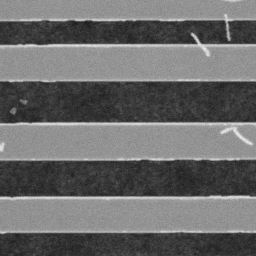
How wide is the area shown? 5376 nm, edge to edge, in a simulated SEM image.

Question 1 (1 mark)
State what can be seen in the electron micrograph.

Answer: lines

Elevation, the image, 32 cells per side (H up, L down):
HHHHHHHHHHHHHHHHHHHHHHHHHHHHHHHH
HHHHHHHHHHHHHHHHHHHHHHHHHHHHHHHH
HHHHHHHHHHHHHHHHHLLLHHHLLLLLHLLL
LLLLLLLLLLLLLLLLLLLLLLLLLLLLLLLL
LLLLLLLLLLLLLLLLLLLLLLLLLLLLLLLL
LLLLLLLLLLLLLLLLLLLLLLLLHLLLLLLL
HHHHHHHHHHHHHHHHHHHHHHHHHHHHHHHH
HHHHHHHHHHHHHHHHHHHHHHHHHHHHHHHH
HHHHHHHHHHHHHHHHHHHHHHHHHHHHHHHH
HHHHHHHHHHHHHHHHHHHHHHHHHHHHHHHH
LLLLLLLLLLLLLLLLLLLLLLLLLLLLLLLL
LLLLLLLLLLLLLLLLLLLLLLLLLLLLLLLL
LLLLLLLLLLLLLLLLLLLLLLLLLLLLLLLL
LLLLLLLLLLLLLLLLLLLLLLLLLLLLLLLL
LLLLLLLLLLLLLLLLLLLLLLLLLLLLLLLL
LLLLHLHHLHHHHHHHHHHHHHHHHHHHHHHH
HHHHHHHHHHHHHHHHHHHHHHHHHHHHHHHH
HHHHHHHHHHHHHHHHHHHHHHHHHHHHHHHH
HHHHHHHHHHHHHHHHHHHHHHHHHHHHHHHH
HHHHHHHHHHHHHHHHHHHHHHHHHHHHHHHH
LLLLLLLLLLLLLLLLLLLLLLLLLLLLLLLL
LLLLLLLLLLLLLLLLLLLLLLLLLLLLLLLL
LLLLLLLLLLLLLLLLLLLLLLLLLLLLLLLL
LLLLLLLLLLLLLLLLLLLLLLLLLLLLLLLL
LLLLLLLLLLLLLLLLLLLLLLLLLLLLLLLL
HHHHHHHHHHHHHHHHHHHHHHHHHHHHHHHH
HHHHHHHHHHHHHHHHHHHHHHHHHHHHHHHH
HHHHHHHHHHHHHHHHHHHHHHHHHHHHHHHH
HHHHHHHHHHHHHHHHHHHHHHHHHHHHHHHH
LLLLLLLLLLLLLLLLLLLLLLLLLLLLLLLL
LLLLLLLLLLLLLLLLLLLLLLLLLLLLLLLL
LLLLLLLLLLLLLLLLLLLLLLLLLLLLLLLL